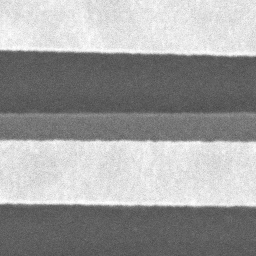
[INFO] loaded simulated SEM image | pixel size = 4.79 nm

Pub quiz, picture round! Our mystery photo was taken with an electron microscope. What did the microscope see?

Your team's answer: lines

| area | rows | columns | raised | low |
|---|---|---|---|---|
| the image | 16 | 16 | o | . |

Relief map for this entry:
oooooooooooooooo
oooooooooooooooo
oooooooooooooooo
................
................
................
................
oooooooooooooooo
oooooooooooooooo
oooooooooooooooo
oooooooooooooooo
oooooooooooooooo
oooooooooooooooo
................
................
................